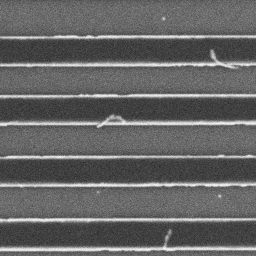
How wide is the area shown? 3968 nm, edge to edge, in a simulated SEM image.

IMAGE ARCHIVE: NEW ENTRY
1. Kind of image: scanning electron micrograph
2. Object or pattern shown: lines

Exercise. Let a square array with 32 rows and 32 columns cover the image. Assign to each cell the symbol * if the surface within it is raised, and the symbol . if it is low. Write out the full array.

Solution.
................................
................................
................................
................................
................................
********************************
********************************
********************************
................................
................................
................................
................................
********************************
********************************
********************************
*********************...........
................................
................................
................................
...............................*
********************************
********************************
********************************
................................
................................
................................
................................
...**.**************************
********************************
********************************
********************************
................................